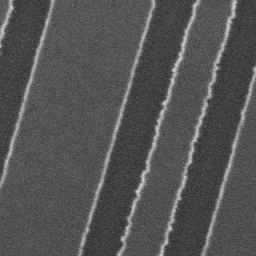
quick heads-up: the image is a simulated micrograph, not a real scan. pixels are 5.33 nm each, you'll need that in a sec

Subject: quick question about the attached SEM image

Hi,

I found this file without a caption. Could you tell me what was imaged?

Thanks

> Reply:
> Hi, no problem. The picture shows lines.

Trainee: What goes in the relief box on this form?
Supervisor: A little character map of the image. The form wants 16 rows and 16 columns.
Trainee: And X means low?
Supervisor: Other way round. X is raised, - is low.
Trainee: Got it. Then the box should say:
X--XXXXXXX--XXX-
---XXXXXX---XX--
---XXXXXX--XXX--
--XXXXXXX--XXX--
--XXXXXX---XX---
--XXXXXX---XX---
-XXXXXXX--XXX--X
-XXXXXX---XXX--X
-XXXXXX---XX---X
-XXXXXX--XXX---X
XXXXXXX--XXX--XX
XXXXXX---XX---XX
XXXXXX--XXX---XX
XXXXXX--XXX--XXX
XXXXX---XXX--XXX
XXXXX---XX---XXX